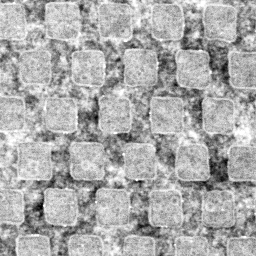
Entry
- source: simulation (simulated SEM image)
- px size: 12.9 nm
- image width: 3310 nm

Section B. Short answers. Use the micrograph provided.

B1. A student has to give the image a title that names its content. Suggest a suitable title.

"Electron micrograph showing a regular array of raised bodies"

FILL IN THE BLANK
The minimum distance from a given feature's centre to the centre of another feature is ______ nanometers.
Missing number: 676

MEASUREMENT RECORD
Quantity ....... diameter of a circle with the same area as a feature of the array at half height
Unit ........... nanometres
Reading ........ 481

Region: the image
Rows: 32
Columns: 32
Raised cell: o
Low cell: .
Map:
o.....ooo....ooo................
ooo...oooo..oooo...oooo...ooo...
ooo...oooo..oooo...oooo..ooooo..
ooo...oooo..ooooo..oooo...ooo...
ooo...oooo...ooo...oooo...ooo...
................................
...ooo....oo....ooo...ooo....o..
...ooo...oooo...oooo..oooo...ooo
..oooo...oooo...oooo..oooo...ooo
...ooo...oooo...oooo..oooo...ooo
....oo....ooo...ooo....ooo...ooo
................................
ooo...ooo...oooo...oooo...ooo...
ooo...ooo...oooo...oooo..oooo...
ooo...oooo..oooo...oooo..oooo...
ooo...oooo...ooo...oooo..oooo...
.............o.o...oooo...ooo...
................................
..oooo...oooo...ooo...oooo...ooo
..oooo...oooo...ooo...oooo...ooo
..oooo...oooo...ooo...oooo...ooo
..oooo...oooo...ooo...oooo...ooo
........................oo....oo
................................
ooo...ooo...oooo...oooo...ooo...
ooo...oooo..oooo...oooo...ooo...
ooo...oooo..oooo...oooo..oooo...
ooo...oooo..oooo...oooo..oooo...
................................
...o.....oo.....................
..oooo...oooo...ooo...oooo..oooo
..oooo...oooo...ooo...oooo...ooo